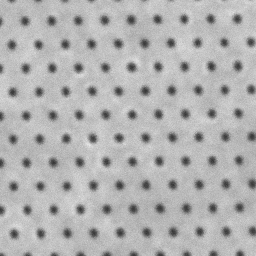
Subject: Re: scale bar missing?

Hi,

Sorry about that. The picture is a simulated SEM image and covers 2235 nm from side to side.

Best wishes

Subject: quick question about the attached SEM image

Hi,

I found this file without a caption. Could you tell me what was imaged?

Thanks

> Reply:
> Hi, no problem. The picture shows a regular array of holes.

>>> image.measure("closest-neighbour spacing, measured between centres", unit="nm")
231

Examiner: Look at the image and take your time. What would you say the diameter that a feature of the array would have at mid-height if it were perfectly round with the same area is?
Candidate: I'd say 0.0842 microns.